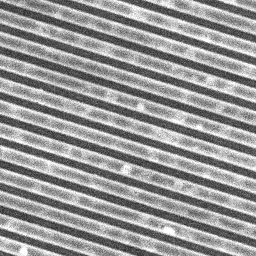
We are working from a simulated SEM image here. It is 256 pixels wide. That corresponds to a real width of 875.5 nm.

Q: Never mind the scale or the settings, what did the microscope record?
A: parallel lines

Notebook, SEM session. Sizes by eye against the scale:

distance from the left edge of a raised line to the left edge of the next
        21.7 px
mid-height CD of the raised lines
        12.5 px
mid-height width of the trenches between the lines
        29.8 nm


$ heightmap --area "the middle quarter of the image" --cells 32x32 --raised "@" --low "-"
@@@@@@@@@@@--------@@@@@@@@@@---
---@@@@@@@@@@@@-------@@@@@@@@@@
-------@@@@@@@@@@@-------@@@@@@@
@@@-------@@@@@@@@@@@-------@@@@
@@@@@@-------@@@@@@@@@@@--------
@@@@@@@@@-------@@@@@@@@@@@@----
--@@@@@@@@@@-------@@@@@@@@@@@@-
-----@@@@@@@@@@--------@@@@@@@@@
--------@@@@@@@@@@@-------@@@@@@
@@@--------@@@@@@@@@@@-------@@@
@@@@@@@--------@@@@@@@@@@-------
@@@@@@@@@@--------@@@@@@@@@@----
--@@@@@@@@@@@@-------@@@@@@@@@@-
------@@@@@@@@@@--------@@@@@@@@
@--------@@@@@@@@@@--------@@@@@
@@@@@-------@@@@@@@@@@---------@
@@@@@@@@-------@@@@@@@@@@@------
-@@@@@@@@@@-------@@@@@@@@@@@---
----@@@@@@@@@@--------@@@@@@@@@@
-------@@@@@@@@@@--------@@@@@@@
@@@------@@@@@@@@@@@@-------@@@@
@@@@@--------@@@@@@@@@@@-------@
@@@@@@@@@--------@@@@@@@@@@-----
-@@@@@@@@@@@--------@@@@@@@@@@--
----@@@@@@@@@@@-------@@@@@@@@@@
--------@@@@@@@@@@-------@@@@@@@
@@@@-------@@@@@@@@@@--------@@@
@@@@@@@-------@@@@@@@@@@@-------
@@@@@@@@@@-------@@@@@@@@@@@----
--@@@@@@@@@@@-------@@@@@@@@@@@-
-----@@@@@@@@@@@--------@@@@@@@@
@-------@@@@@@@@@@@@-------@@@@@